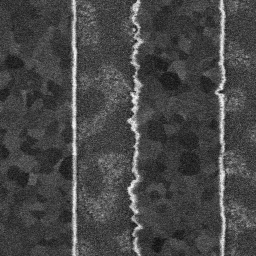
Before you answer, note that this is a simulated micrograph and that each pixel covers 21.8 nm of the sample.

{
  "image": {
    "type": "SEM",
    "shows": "one or a few lines or trenches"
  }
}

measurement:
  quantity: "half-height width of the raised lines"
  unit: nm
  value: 1890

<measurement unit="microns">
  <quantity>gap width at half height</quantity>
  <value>1.32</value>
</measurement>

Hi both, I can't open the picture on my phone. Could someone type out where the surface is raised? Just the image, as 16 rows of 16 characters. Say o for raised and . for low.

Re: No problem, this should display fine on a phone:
ooooo....ooooo..
ooooo....ooooo..
ooooo....ooooo..
ooooo...oooooo..
ooooo....ooooo..
ooooo....ooooo..
ooooo...oooooo..
ooooo...oooooo..
ooooo....ooooo..
ooooo...oooooo..
ooooo...oooooo..
ooooo...oooooo..
ooooo...oooooo..
ooooo...oooooo..
ooooo...oooooo..
ooooo....ooooo..